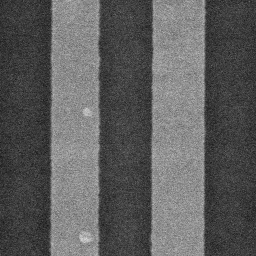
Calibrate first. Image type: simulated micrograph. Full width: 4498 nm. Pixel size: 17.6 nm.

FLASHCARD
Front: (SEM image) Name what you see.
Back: lines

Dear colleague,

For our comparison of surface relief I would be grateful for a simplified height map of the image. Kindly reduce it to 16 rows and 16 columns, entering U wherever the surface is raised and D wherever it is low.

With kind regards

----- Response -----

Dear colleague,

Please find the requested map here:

DDDUUUDDDDUUUDDD
DDDUUUDDDDUUUDDD
DDDUUUDDDDUUUDDD
DDDUUUDDDDUUUDDD
DDDUUUDDDDUUUDDD
DDDUUUDDDDUUUDDD
DDDUUUDDDDUUUDDD
DDDUUUDDDDUUUDDD
DDDUUUDDDDUUUDDD
DDDUUUDDDDUUUDDD
DDDUUUDDDDUUUDDD
DDDUUUDDDDUUUDDD
DDDUUUDDDDUUUDDD
DDDUUUDDDDUUUDDD
DDDUUUDDDUUUUDDD
DDDUUUDDDUUUUDDD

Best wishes